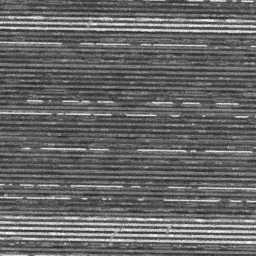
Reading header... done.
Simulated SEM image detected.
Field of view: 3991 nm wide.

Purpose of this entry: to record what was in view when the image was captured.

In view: parallel lines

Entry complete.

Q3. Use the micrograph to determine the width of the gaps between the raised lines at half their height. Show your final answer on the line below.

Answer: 56.5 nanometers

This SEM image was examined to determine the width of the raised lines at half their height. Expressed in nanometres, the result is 29.2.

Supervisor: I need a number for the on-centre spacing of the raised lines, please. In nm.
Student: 82